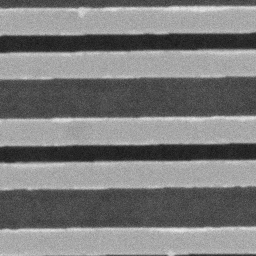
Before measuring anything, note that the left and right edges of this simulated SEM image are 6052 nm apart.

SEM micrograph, lines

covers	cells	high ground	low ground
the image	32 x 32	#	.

................................
################################
################################
################################
................................
................................
............####################
################################
################################
############################....
................................
................................
................................
................................
................................
################################
################################
################################
................................
................................
##....##########################
################################
################################
##############..................
................................
................................
................................
................................
................................
################################
################################
################################